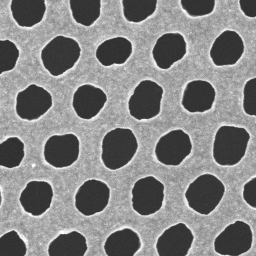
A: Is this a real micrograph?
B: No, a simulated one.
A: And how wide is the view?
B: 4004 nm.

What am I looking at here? a regular array of holes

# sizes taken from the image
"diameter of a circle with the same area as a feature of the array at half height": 552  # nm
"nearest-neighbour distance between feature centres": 854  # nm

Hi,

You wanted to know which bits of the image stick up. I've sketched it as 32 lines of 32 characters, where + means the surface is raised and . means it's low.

+.....+++....++.....+++....+++..
+.....+++....++....++++...++++..
++...++++...++++..++++++++++++++
++++++++++++++++++++++++++++++++
++++++++++++++++++++...++++...++
..++++....+++...+++....++++...++
..+++.....++....+++....+++....++
..+++.....++....+++...+++++...++
..++++...+++++++++++.+++++++++++
++++++++++++++++++++++++++++++++
+++++++++++++++++...++++..+++++.
+++...+++....++++...+++....+++..
++....+++....+++....+++....+++..
++....+++....+++....+++...++++..
++...+++++..+++++..+++++++++++++
++++++++++++++++++++++++++++++++
++++++++++++++...++++..++++....+
+.++++....+++....+++....+++....+
...+++....+++....++.....+++....+
...+++....+++....+++...++++...++
..++++...++++...++++..+++++..+++
++++++++++++++++++++++++++++++++
+++++++++++.+++++...++++...++++.
+++...++++....+++....+++....++..
+++....++.....+++...+++.....++..
+++...+++....++++...++++...++++.
+++...++++...++++...+++++.++++++
++++++++++++++++++++++++++++++++
+++++++++++++++++++++...++++...+
..+++++...++++...+++....+++.....
...+++.....++.....++....+++....+
...+++.....++....+++...++++....+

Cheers